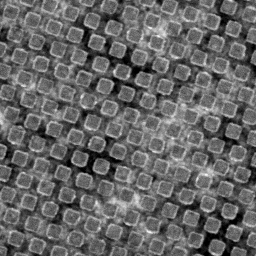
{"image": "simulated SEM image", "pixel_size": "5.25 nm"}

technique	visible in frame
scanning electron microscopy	a regular array of raised bodies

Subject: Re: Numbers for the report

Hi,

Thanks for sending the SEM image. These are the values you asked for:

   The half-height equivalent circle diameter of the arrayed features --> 0.0797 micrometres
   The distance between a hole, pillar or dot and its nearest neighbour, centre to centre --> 116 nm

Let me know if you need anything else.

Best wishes